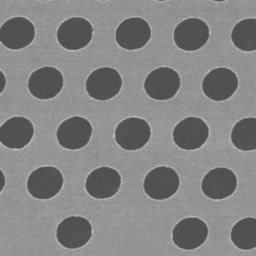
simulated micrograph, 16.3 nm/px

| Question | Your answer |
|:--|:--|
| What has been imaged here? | a regular array of holes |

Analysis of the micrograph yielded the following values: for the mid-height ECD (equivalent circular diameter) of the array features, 564 nm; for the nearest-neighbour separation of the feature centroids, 0.935 micrometres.